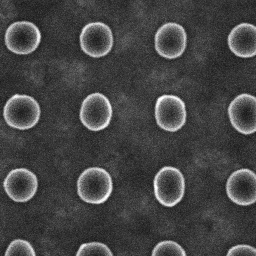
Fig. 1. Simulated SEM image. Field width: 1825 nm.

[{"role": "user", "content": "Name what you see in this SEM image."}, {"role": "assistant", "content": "a regular array of raised bodies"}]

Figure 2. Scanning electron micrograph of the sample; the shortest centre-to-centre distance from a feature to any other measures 520 nm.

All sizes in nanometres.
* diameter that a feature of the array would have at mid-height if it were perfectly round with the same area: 237